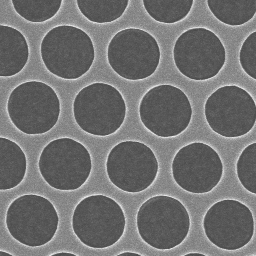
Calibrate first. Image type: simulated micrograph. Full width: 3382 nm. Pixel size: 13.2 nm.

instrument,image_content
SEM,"a regular array of holes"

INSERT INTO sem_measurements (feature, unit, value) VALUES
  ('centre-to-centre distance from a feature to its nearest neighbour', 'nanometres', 855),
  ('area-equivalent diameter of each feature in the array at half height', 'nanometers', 688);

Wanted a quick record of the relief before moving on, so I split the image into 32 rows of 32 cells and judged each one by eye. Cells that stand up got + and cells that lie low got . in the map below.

++......++......++......++......
++.....+++.....+++......++......
+++...+++++...+++++...+++++....+
.++++++...++++++++++++++++++++++
...+++.....+++.....+++.....++++.
...++.......++......++......++..
....+.......+.......++......++..
...++.......++......++......++..
...+++.....+++......++......++..
.++++++...+++++....++++....++++.
+++...++++++.+++++++++++++++++++
++.....+++.....+++.....++++....+
+......++......+++......++......
+......++.......+.......++......
+......++.......++......++......
++.....+++.....+++......++......
+++...+++++...+++++....++++....+
.++++++..+++++++++++++++++++++++
...+++.....+++.....++++...+++++.
...++......+++.....+++.....+++..
...++......++.......++......++..
...++......++.......++......++..
...+++.....+++.....+++.....+++..
.++++++...+++++...+++++....++++.
+++..+++++++.+++++++.+++++++++++
+.....++++.....+++.....++++...++
+......++......++......+++.....+
+......++.......+.......+.......
+......++.......+.......++......
++.....+++.....+++.....+++......
+++...+++++...+++++...+++++....+
++++++++++++++++++++++++++++++++